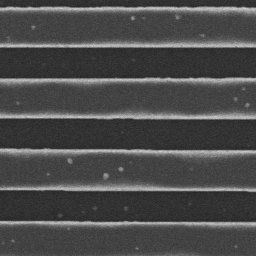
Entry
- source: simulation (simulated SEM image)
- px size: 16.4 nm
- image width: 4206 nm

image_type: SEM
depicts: lines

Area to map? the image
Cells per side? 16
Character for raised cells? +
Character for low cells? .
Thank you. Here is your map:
+..++.+++++...+.
++++++++++++++++
++++++++++++++++
................
................
++++++++++++++++
++++++++++++++++
................
................
++++++++++++++++
++++++++++++++++
++++++++++++++++
................
................
++++++++++++++++
++++++++++++++++